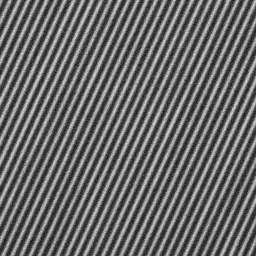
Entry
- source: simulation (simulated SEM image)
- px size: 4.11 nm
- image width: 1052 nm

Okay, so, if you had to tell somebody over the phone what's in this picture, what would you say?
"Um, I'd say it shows parallel lines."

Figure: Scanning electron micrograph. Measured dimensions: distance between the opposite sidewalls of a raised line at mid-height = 0.0077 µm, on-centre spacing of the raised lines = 0.034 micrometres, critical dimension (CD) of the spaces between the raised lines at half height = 26.6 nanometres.